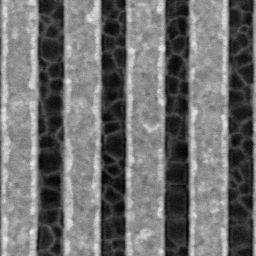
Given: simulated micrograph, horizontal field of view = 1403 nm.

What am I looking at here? one or a few lines or trenches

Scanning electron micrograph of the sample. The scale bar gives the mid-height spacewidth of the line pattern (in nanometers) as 151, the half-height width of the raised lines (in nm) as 197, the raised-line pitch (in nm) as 346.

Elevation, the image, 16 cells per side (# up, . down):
##..##..##..##..
##..##..##..##..
##..##..##..##..
##..##..##..##..
##..##..##..##..
##..##..##..##..
##..##..##..##..
##..##..##..##..
##..##..##..##..
##..##..##..##..
##..##..##..##..
##..##..##..##..
##..##..##..##..
##..##..##..##..
##..##..##..##..
##..##..##..##..